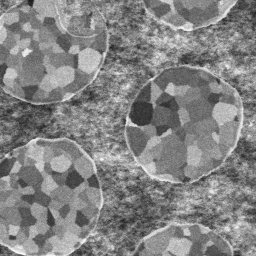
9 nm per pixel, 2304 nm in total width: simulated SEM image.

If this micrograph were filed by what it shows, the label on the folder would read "raised bodies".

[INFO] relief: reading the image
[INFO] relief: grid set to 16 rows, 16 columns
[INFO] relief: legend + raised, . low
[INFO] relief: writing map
.+++++...+++++..
+++++++...+++...
+++++++.........
+++++++.........
++++++....+++...
+++++....++++++.
........+++++++.
........+++++++.
........+++++++.
.++++...++++++..
++++++...+++++..
++++++..........
++++++..........
++++++..........
++++++....+++...
.++++....+++++..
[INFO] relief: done